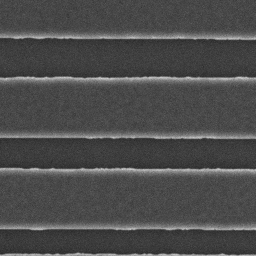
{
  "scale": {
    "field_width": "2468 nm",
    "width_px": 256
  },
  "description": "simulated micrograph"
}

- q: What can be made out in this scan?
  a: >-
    lines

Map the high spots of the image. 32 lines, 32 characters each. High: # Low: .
################################
################################
################################
################################
################################
................................
................................
................................
................................
................................
################################
################################
################################
################################
################################
################################
################################
................................
................................
................................
................................
################################
################################
################################
################################
################################
################################
################################
################################
................................
................................
................................